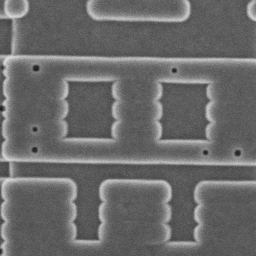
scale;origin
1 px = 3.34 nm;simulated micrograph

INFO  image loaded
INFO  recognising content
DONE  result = wiring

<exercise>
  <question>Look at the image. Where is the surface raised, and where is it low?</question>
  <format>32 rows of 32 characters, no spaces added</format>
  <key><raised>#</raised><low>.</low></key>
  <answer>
.##........#############.......#
.##........#############.......#
...................####.........
................................
................................
................................
................................
.###############################
.###.###########################
.###############################
########......######......######
########......######......######
.#######......######......######
.#######......######......######
########......######......######
########......######......######
########......######......######
.####################.....######
################################
################################
..............................##
................................
.########.......................
#########....########....#######
#########....########...########
#########....########....#######
#########....########...########
#########....########....#######
#########...#########....#######
#########...#########...########
################################
################################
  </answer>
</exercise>